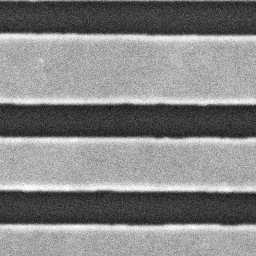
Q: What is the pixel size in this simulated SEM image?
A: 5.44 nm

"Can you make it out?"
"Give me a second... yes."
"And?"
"lines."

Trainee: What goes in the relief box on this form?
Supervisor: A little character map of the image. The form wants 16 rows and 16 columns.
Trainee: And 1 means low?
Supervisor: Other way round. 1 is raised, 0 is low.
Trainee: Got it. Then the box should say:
0000000000000000
0000000000000000
1111111111111111
1111111111111111
1111111111111111
1111111111111111
0000000000000000
0000000000000000
0000000000000000
1111111111111111
1111111111111111
1111111111111111
0000000000000000
0000000000000000
1111111111111111
1111111111111111